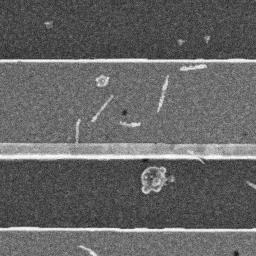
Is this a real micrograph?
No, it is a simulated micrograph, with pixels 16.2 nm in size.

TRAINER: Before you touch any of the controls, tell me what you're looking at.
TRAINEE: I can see lines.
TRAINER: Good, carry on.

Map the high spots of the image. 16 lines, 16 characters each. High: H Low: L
LLLLLLLLLLLLLLLL
LLLLLLLLLLLLLLLL
LLLLLLLLLLLLLLLL
LLLLLLLLLLLLLLLL
HHHHHHHHHHHHHHHH
HHHHHHHHHHHHHHHH
HHHHHHHHHHHHHHHH
HHHHHHHHHHHHHHHH
HHHHHHHHHHHHHHHH
HHHHHHHHHHHHHHHH
LLLLLLLLLLLLLLLL
LLLLLLLLLLLLLLLL
LLLLLLLLLLLLLLLL
LLLLLLLLLLLLLLLL
HHHHHHHHHHHHHHHH
HHHHHHHHHHHHHHHH